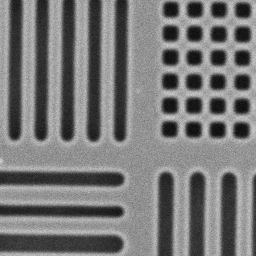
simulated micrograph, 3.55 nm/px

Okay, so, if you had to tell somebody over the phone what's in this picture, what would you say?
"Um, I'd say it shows groups of lines, slits or small figures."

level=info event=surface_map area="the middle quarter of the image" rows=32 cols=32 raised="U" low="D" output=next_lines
DDDUUUDDDUUUUDDDUUUUUUUUUUDUUUUU
DDDUUUDDDUUUDDDDUUUUUUUUUUUUUUUU
DDDUUUDDDUUUDDDDUUUUUUUUUDDDUUUD
DDDUUUDDDUUUDDDDUUUUUUUUDDDDDUUD
DDDUUUDDDUUUDDDDUUUUUUUUDDDDDUDD
DDDUUUDDDUUUDDDDUUUUUUUUDDDDDUUD
DDDUUUDDDUUUDDDDUUUUUUUUUDDDUUUD
DDDUUUDDDUUUDDDDUUUUUUUUUUUUUUUU
DDDUUUDDDUUUDDDDUUUUUUUUUDDDUUUD
DDDUUUDDDUUUDDDDUUUUUUUUDDDDDUDD
DDDUUUDDDUUUDDDDUUUUUUUUDDDDDUDD
DDDUUUDDDUUUDDDDUUUUUUUUDDDDDUUD
DDDUUUDDDUUUDDDDUUUUUUUUUUDUUUUU
DDDUUUDDDUUUDDDDUUUUUUUUUUUUUUUU
DDDUUUDDDUUUDDDDUUUUUUUUUDDDUUUD
DDDUUUDDDUUUDDDDUUUUUUUUDDDDDUDD
DDDUUDDDDUUUDDDDUUUUUUUUDDDDDUDD
DDDUUUDDDUUUDDDDUUUUUUUUDDDDUUDD
DDUUUUDDDUUUUDDUUUUUUUUUUUDUUUUD
DUUUUUUDUUUUUDDUUUUUUUUUUUUUUUUU
UUUUUUUUUUUUUUUUUUUUUUUUUUUUUUUU
UUUUUUUUUUUUUUUUUUUUUUUUUUUUUUUU
UUUUUUUUUUUUUUUUUUUUUUUUUUUUUUUU
UUUUUUUUUUUUUUUUUUUUUUUUUUUUUUUU
UUUUUUUUUUUUUUUUUUUUUUUUUUUUUUUU
UUUUUUUUUUUUUUUUUUUUUUUUUUUUUUUU
UUUUUUUUUUUUUUUUUUUUUUUUUUUUUUUU
DDDDDDDDDDDDDDDUUUUUUUUUDDDUUUUU
DDDDDDDDDDDDDDDUUUUUUUUUDDDUUUUD
DDDDDDDDDDDDDDDUUUUUUUUDDDDDUUUD
DDDDDDDDDDDDDDUUUUUUUUUDDDDDUUUD
UUUUUUUUUUUUUUUUUUUUUUUDDDDDUUUD